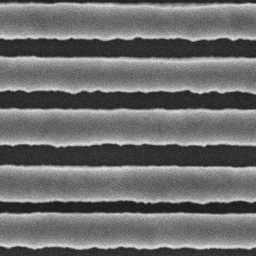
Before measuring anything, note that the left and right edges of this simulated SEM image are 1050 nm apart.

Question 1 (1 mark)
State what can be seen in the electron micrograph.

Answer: lines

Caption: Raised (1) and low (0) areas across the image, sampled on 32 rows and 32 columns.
11111111111111100000000000101111
11111111111111111111111111111111
11111111111111111111111111111111
11111111111111111111111111111111
11111111111111111111111111111111
00000000000000000000000000000000
00000000000000000000000000000000
11111111111111111111111111111111
11111111111111111111111111111111
11111111111111111111111111111111
11111111111111111111111111111111
00010000110101011110010011011011
00000000000000000000000000000000
00000000000000000000000000000000
11111111111111111111111111111111
11111111111111111111111111111111
11111111111111111111111111111111
11111111111111111111111111111111
00000000000000000000000000000000
00000000000000000000000000000000
00000000000000000000000000000000
11111111111111111111111111111111
11111111111111111111111111111111
11111111111111111111111111111111
11111111111111111111111111111111
00000000000000000000000000000000
00000000000000000000000000000000
11111111111111111111111111111111
11111111111111111111111111111111
11111111111111111111111111111111
11111111111111111111111111111111
00000000000000000000000000000000